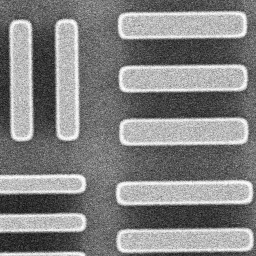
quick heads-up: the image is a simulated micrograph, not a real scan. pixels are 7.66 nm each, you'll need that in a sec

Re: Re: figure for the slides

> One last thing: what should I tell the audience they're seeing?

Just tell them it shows groups of lines, slits or small figures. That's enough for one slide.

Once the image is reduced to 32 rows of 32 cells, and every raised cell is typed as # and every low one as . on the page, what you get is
................................
................................
...............################.
.###...###.....################.
.###...###.....###############..
.###...###......................
.###...###......................
.###...###......................
.###...###......##############..
.###...###.....################.
.###...###.....################.
.###...###......................
.###...###......................
.###...###......................
.###...###......................
.###...###.....################.
.###...###.....################.
...............################.
................................
................................
................................
................................
##########......................
##########.....################.
...............################.
................#...............
................................
###########.....................
##########......................
...............################.
...............################.
................................